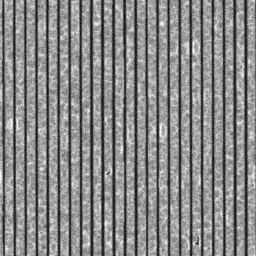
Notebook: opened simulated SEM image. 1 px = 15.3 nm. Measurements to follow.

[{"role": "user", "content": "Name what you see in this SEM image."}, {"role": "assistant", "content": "parallel lines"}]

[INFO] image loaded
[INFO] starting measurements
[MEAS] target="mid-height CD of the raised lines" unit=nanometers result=123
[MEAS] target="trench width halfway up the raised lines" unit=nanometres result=40.2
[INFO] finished